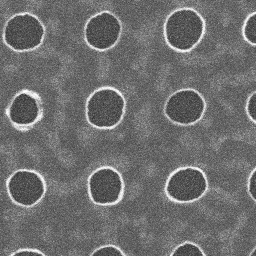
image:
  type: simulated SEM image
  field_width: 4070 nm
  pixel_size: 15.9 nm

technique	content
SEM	a regular array of holes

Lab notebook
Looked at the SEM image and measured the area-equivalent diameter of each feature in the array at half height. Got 573 nanometers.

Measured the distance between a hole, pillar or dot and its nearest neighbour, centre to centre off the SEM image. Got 1230 nm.